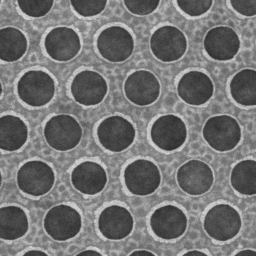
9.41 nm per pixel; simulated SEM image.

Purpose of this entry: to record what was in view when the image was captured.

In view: a regular array of holes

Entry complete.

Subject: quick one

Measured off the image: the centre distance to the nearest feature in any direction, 486 nanometers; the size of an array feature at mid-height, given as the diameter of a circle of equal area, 0.347 µm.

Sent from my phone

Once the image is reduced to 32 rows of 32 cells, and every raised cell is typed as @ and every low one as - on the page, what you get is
@@-----@@----@@-----@@-----@@---
@@@---@@@@---@@@---@@@@---@@@@--
@@@@@@@@@@@@@@@@@@@@@@@@@@@@@@@@
--@@@@@--@@@@---@@@@--@@@@@--@@@
---@@@----@@-----@@----@@@----@@
----@-----@@-----@@----@@-----@@
---@@@----@@-----@@----@@@----@@
--@@@@@--@@@@---@@@@--@@@@@--@@@
@@@@@@@@@@@@@@@@@@@@@@@@@@@@@@@@
@@@---@@@----@@@---@@@@---@@@---
@@-----@@----@@-----@@-----@@---
@@-----@@----@@-----@@-----@@---
@@@---@@@----@@@----@@@---@@@---
@@@@@@@@@@@@@@@@@@@@@@@@@@@@@@@@
--@@@@@--@@@@@-@@@@@--@@@@@--@@@
---@@@----@@----@@@----@@@----@@
----@-----@@-----@@----@@-----@@
---@@@----@@-----@@----@@@----@@
---@@@@--@@@@---@@@@--@@@@---@@@
@@@@@@@@@@@@@@@@@@@@@@@@@@@@@@@@
@@@---@@@@---@@@---@@@@---@@@@--
@@-----@@----@@-----@@-----@@---
@@-----@@----@@@----@@-----@@---
@@-----@@----@@@----@@@---@@@---
@@@@-@@@@@@@@@@@@-@@@@@@-@@@@@@@
@@@@@@@@@@@@@@@@@@@@@@@@@@@-@@@@
---@@@----@@@---@@@----@@@----@@
----@-----@@-----@@----@@-----@@
----@-----@@-----@@----@@-----@@
---@@@---@@@@---@@@@---@@@---@@@
@@@@@@@@@@@@@@@@@@@@@@@@@@@@@@@@
@@@---@@@@--@@@@@--@@@@--@@@@@--